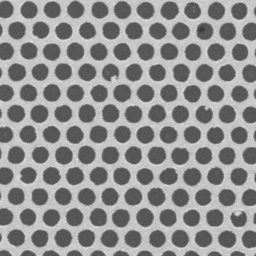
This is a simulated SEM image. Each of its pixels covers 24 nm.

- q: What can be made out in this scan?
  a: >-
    a regular array of holes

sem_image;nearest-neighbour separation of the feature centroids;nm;556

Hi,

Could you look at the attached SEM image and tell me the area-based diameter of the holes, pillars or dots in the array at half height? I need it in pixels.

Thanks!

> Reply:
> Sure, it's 18.1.